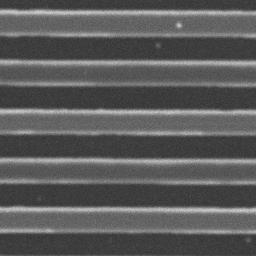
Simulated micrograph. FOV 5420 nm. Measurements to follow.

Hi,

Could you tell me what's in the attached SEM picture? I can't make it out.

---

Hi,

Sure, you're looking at lines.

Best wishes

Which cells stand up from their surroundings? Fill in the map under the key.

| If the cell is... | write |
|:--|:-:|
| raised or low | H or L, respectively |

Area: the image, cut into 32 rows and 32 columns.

LLLLLLLLLLLLLLLLLLLLLLLLLLLLLLLL
HHHHHHHHHHHHHHHHHHHHHHLLLLLLLLLL
HHHHHHHHHHHHHHHHHHHHHHHHHHHHHHHH
HHHHHHHHHHHHHHHHHHHHHHHHHHHHHHHH
LLLLLLLLLLLLLLLLLLLLLLLLLLLLLLLH
LLLLLLLLLLLLLLLLLLLLLLLLLLLLLLLL
LLLLLLLLLLLLLLLLLLLLLLLLLLLLLLLL
LLLLLLLLLLLLLLLLLLLLLLLLLLLLLLLL
HHHHHHHHHHHHHHHHHHHHHHHHHHHHHHHH
HHHHHHHHHHHHHHHHHHHHHHHHHHHHHHHH
HHHHHHHHHHHHHHHHHHHHHHHHHHHHHHHH
LLLLLLLLLLLLLLLLLLLLLLLLLLLLLLLL
LLLLLLLLLLLLLLLLLLLLLLLLLLLLLLLL
LLLLLLLLLLLLLLLLLLLLLLLLLLLLLLLL
HHHHHHHHHHHHHHHHHHHHHHHHHHHHHHHH
HHHHHHHHHHHHHHHHHHHHHHHHHHHHHHHH
HHHHHHHHHHHHHHHHHHHHHHHHHHHHHHHH
LLLLLLLLLLLLLLLLLLLLLLLLLLLLLLLL
LLLLLLLLLLLLLLLLLLLLLLLLLLLLLLLL
LLLLLLLLLLLLLLLLLLLLLLLLLLLLLLLL
HHHHHHHHHHHHHHHHHHHHHHHHHHHHHHHH
HHHHHHHHHHHHHHHHHHHHHHHHHHHHHHHH
HHHHHHHHHHHHHHHHHHHHHHHHHHHHHHHH
LLLLLLLLLLLLLLLLLLLLLLLLLLLLLLLL
LLLLLLLLLLLLLLLLLLLLLLLLLLLLLLLL
LLLLLLLLLLLLLLLLLLLLLLLLLLLLLLLL
HHHHHHHHHHHHHHHHHHHHHHHHHHHHHHHH
HHHHHHHHHHHHHHHHHHHHHHHHHHHHHHHH
HHHHHHHHHHHHHHHHHHHHHHHHHHHHHHHH
LLLLLLLLLLLLLLLLLLLLLLLLLLLLLLLL
LLLLLLLLLLLLLLLLLLLLLLLLLLLLLLLL
LLLLLLLLLLLLLLLLLLLLLLLLLLLLLLLL